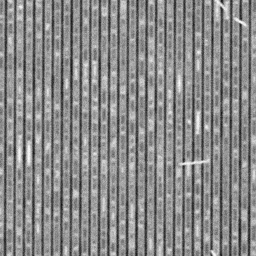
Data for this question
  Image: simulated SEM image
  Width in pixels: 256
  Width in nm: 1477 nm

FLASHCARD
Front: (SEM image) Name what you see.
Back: parallel lines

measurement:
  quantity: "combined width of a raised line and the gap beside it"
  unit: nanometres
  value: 54.1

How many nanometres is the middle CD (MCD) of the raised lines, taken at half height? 34.6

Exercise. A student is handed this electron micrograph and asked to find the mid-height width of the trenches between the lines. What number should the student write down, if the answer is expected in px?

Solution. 3.38